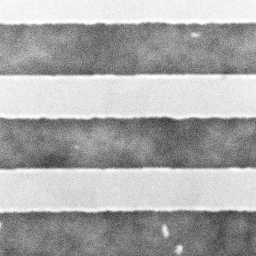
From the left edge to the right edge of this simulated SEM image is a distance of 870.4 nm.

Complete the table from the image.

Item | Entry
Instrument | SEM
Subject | lines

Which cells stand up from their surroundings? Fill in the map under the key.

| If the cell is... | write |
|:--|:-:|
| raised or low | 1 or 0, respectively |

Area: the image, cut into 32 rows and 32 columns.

11111111111111111111111111111111
11111111111111111111111111111111
11111111111111111111111111111111
00000000000000000000000000000000
00000000000000000000000000000000
00000000000000000000000000000000
00000000000000000000000000000000
00000000000000000000000000000000
00000000000000000000000000000000
00000000000111100111111111111111
11111111111111111111111111111111
11111111111111111111111111111111
11111111111111111111111111111111
11111111111111111111111111111111
11111111111111111111111111111111
00000000000000000000000000000000
00000000000000000000000000000000
00000000000000000000000000000000
00000000000000000000000000000000
00000000000000000000000000000000
00000000000000000000000000000000
11111111111111111111111111111111
11111111111111111111111111111111
11111111111111111111111111111111
11111111111111111111111111111111
11111111111111111111111111111111
00000000000000000000000000000000
00000000000000000000000000000000
00000000000000000000000000000000
00000000000000000000000000000000
00000000000000000000000000000000
00000000000000000000000000000000